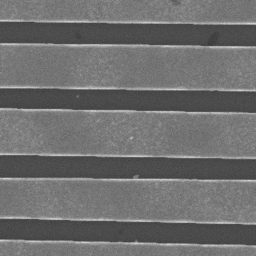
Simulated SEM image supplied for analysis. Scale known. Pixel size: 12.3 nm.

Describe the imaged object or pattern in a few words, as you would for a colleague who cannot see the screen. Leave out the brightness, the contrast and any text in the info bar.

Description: lines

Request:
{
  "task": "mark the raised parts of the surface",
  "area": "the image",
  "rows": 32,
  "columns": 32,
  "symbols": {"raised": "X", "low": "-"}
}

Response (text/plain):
XXXXXXXXXXXXXXXXXXXXXXXXXXXXXXXX
XXXXXXXXXXXXXXXXXXXXXXXXXXXXXXXX
XXXXXXXXXXXXXXXXXXXXXXXXXXXXXXXX
--------------------------------
--------------------------------
XXXXX---------------------------
XXXXXXXXXXXXXXXXXXXXXXXXXXXXXXXX
XXXXXXXXXXXXXXXXXXXXXXXXXXXXXXXX
XXXXXXXXXXXXXXXXXXXXXXXXXXXXXXXX
XXXXXXXXXXXXXXXXXXXXXXXXXXXXXXXX
XXXXXXXXXXXXXXXXXXXXXXXXXXXXXXXX
--------------------------------
--------------------------------
--------------------------------
XXXXXXXXXXXXXXXXXXXXXXXXXXXXXXXX
XXXXXXXXXXXXXXXXXXXXXXXXXXXXXXXX
XXXXXXXXXXXXXXXXXXXXXXXXXXXXXXXX
XXXXXXXXXXXXXXXXXXXXXXXXXXXXXXXX
XXXXXXXXXXXXXXXXXXXXXXXXXXXXXXXX
--------------XXXXXXXXXXXXXXXXXX
--------------------------------
--------------------------------
XXXXXXXXXXXXXXXXXXXXXXX---------
XXXXXXXXXXXXXXXXXXXXXXXXXXXXXXXX
XXXXXXXXXXXXXXXXXXXXXXXXXXXXXXXX
XXXXXXXXXXXXXXXXXXXXXXXXXXXXXXXX
XXXXXXXXXXXXXXXXXXXXXXXXXXXXXXXX
---------XXXXXXXXXXXXXXXXXXXXXXX
--------------------------------
--------------------------------
XXXXXXXXXXXXXXXXXXX-------------
XXXXXXXXXXXXXXXXXXXXXXXXXXXXXXXX